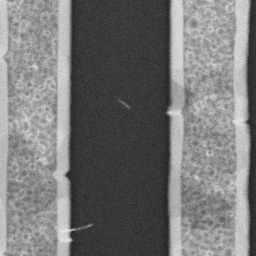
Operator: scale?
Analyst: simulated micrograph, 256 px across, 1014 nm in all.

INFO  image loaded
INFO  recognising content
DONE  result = one or a few lines or trenches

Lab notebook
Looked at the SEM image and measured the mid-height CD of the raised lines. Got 61.9 px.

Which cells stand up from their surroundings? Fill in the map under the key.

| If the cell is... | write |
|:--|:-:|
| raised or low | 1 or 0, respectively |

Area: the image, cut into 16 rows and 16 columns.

1111000000011110
1111000000011110
1111000000011110
1111000000011110
1111000000011110
1111000000011110
1111000000011110
1111000000011110
1111000000011110
1111000000011110
1111000000011110
1111000000011110
1111000000011110
1111000000011110
1111000000011110
1111000000011110